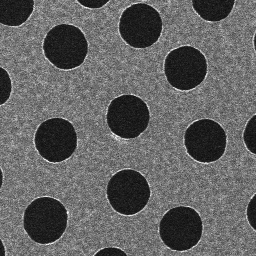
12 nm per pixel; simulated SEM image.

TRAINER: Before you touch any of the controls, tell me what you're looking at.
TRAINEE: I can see a regular array of holes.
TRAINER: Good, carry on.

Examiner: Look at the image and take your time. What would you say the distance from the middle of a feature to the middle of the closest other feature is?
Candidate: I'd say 901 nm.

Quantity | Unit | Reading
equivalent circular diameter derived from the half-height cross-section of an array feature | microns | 0.529